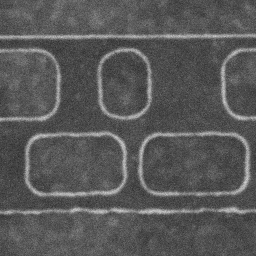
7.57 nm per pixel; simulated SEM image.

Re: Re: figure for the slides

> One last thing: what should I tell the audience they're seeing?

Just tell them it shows one or a few lines or trenches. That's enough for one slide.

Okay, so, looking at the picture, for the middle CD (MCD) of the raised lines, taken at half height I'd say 0.137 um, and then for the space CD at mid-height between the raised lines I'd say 443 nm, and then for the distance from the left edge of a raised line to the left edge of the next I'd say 0.588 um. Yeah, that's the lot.